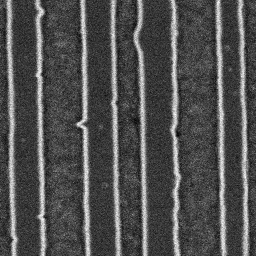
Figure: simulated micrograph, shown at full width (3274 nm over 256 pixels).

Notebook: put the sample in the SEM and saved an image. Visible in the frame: one or a few lines or trenches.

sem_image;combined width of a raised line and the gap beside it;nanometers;879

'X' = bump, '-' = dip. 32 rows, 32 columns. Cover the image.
-XXXX-----XXXX---XXXXX-----XXX--
-XXXX-----XXXX----XXXX-----XXX--
-XXXX-----XXXX----XXXX-----XXX--
-XXXX-----XXXX---XXXXX-----XXX--
-XXXX------XXX---XXXXX-----XXX--
-XXXX------XXX---XXXXX-----XXX--
-XXXX------XXX----XXXX-----XXX--
-XXXX------XXX----XXXX------XX--
-XXXX------XXX----XXXX-----XXX--
-XXXX------XXX----XXXX-----XXX--
-XXXX------XXX----XXXX-----XXX--
-XXXX------XXX----XXXX------XX--
--XXX------XXX----XXXX------XX--
-XXXX------XXX----XXXX------XX--
-XXXX------XXX----XXXX------XX--
--XXX-----XXXX----XXXX------XXX-
-XXXX------XXX----XXXX------XXX-
-XXXX------XXX----XXXX------XXX-
-XXXX------XXX----XXXX------XXX-
-XXXX------XXX----XXXX------XXX-
-XXXX------XXX----XXXX------XXX-
-XXXX------XXX----XXXX------XXX-
-XXXX------XXXX---XXXX------XXX-
--XXX------XXX----XXXX------XXX-
--XXX------XXX----XXXX------XXX-
--XXX------XXXX---XXXX------XXX-
--XXX------XXXX---XXXX------XXX-
--XXX------XXXX---XXXX------XXX-
--XXX------XXXX---XXXX------XXX-
--XXX------XXXX---XXXX------XXX-
--XXX------XXXX---XXXX------XXX-
--XXX------XXXX---XXXX------XXX-